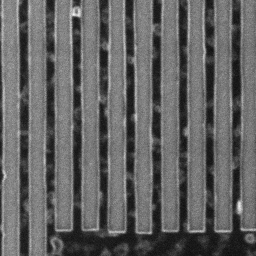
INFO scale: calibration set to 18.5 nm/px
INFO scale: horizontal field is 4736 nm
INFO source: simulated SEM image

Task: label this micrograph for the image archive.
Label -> parallel lines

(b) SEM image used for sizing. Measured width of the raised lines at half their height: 206 nanometers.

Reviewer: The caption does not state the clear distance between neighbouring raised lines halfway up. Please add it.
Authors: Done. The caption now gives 284 nanometers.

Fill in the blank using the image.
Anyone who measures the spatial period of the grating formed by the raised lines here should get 491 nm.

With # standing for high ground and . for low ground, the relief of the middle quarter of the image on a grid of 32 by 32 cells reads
..###....##....###....##.....##.
..###....##....###....##.....##.
..###....##....###....##.....##.
..###....##....###....##.....##.
..###....##....###....##.....##.
..###....##....###....##.....##.
..###....##....###....##.....##.
..###....##....###....##.....##.
..###....##....###....##.....##.
..###....##....###....##.....##.
..###....##....###....##.....##.
..###....##....###....##.....##.
..###....##....###....##.....##.
..###....##....###....##.....##.
..###....##....###....##.....##.
..###...###....###....##.....##.
..###...###....###....##.....##.
..###...###....###....##.....##.
..###...###....###....##.....##.
..###...###....###....##.....##.
..###....##....###....##.....##.
..###....##....###....##.....##.
..###....##....###....##.....##.
..###....##....###....###....##.
..###....##....###....##.....##.
..###....##....###....##....###.
..###....##....###....##....###.
..###....##....###....##....###.
..###....##....###....##.....##.
..###....##....###....##.....##.
..###....##....###....##.....##.
..###....##....###....##.....##.